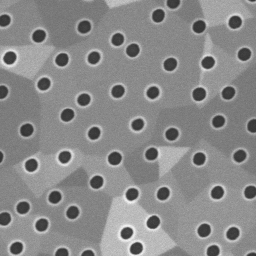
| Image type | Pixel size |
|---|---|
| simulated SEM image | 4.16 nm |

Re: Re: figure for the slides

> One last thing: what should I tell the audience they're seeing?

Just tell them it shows a regular array of holes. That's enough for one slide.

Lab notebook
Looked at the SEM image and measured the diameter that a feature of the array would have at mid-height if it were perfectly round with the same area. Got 58 nm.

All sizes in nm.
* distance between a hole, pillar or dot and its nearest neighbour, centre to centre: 125